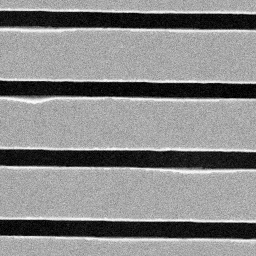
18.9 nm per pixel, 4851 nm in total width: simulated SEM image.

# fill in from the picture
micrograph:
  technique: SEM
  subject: lines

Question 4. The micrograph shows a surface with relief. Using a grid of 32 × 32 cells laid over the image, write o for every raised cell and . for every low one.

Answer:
oooooooooooooooooooooooooooooooo
...........ooooooooooooooooooooo
................................
ooo.............................
oooooooooooooooooooooooooooooooo
oooooooooooooooooooooooooooooooo
oooooooooooooooooooooooooooooooo
oooooooooooooooooooooooooooooooo
oooooooooooooooooooooooooooooooo
oooooooooooooooooooooooooooooooo
................................
................................
oooooooooooooooooooooooooooooooo
oooooooooooooooooooooooooooooooo
oooooooooooooooooooooooooooooooo
oooooooooooooooooooooooooooooooo
oooooooooooooooooooooooooooooooo
oooooooooooooooooooooooooooooooo
oooooooooooooooooooooooooooooooo
................................
................................
oooooooooooooooooooooooooooooooo
oooooooooooooooooooooooooooooooo
oooooooooooooooooooooooooooooooo
oooooooooooooooooooooooooooooooo
oooooooooooooooooooooooooooooooo
oooooooooooooooooooooooooooooooo
.............ooooooooooooooooooo
................................
................................
oooooooooooooooooooooooooooooooo
oooooooooooooooooooooooooooooooo